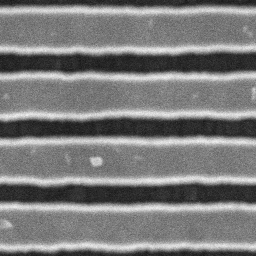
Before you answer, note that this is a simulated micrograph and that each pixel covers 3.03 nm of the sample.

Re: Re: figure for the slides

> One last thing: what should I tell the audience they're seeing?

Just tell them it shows lines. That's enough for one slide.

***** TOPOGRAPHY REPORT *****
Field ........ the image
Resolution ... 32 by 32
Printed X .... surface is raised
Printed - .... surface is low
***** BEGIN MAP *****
--------------------------------
XXXXXXXXXXXXXXXXXXXXXXXXXXXXXXXX
XXXXXXXXXXXXXXXXXXXXXXXXXXXXXXXX
XXXXXXXXXXXXXXXXXXXXXXXXXXXXXXXX
XXXXXXXXXXXXXXXXXXXXXXXXXXXXXXXX
XXXXXXXXXXXXXXXXXXXXXXXXXXXXXXXX
XXXXXXXXXXXXXXXXXXXXXXXXXX------
--------------------------------
--------------------------------
XXXXXXXXXXXXXXXXXXXXXXXXXXXXXXXX
XXXXXXXXXXXXXXXXXXXXXXXXXXXXXXXX
XXXXXXXXXXXXXXXXXXXXXXXXXXXXXXXX
XXXXXXXXXXXXXXXXXXXXXXXXXXXXXXXX
XXXXXXXXXXXXXXXXXXXXXXXXXXXXXXXX
XXXXXXXXXXXXXXXXXXXXXXXXXXXXXXXX
--------------------------------
--------------------------------
XXXXXXXXXXXXXXXXXXXXXXXXXXXXXXXX
XXXXXXXXXXXXXXXXXXXXXXXXXXXXXXXX
XXXXXXXXXXXXXXXXXXXXXXXXXXXXXXXX
XXXXXXXXXXXXXXXXXXXXXXXXXXXXXXXX
XXXXXXXXXXXXXXXXXXXXXXXXXXXXXXXX
XXXXXXXXXXXXXXXXXXXXXXXXXXXXXXXX
--------------------------------
--------------------------------
XXX------------------------XXXX-
XXXXXXXXXXXXXXXXXXXXXXXXXXXXXXXX
XXXXXXXXXXXXXXXXXXXXXXXXXXXXXXXX
XXXXXXXXXXXXXXXXXXXXXXXXXXXXXXXX
XXXXXXXXXXXXXXXXXXXXXXXXXXXXXXXX
XXXXXXXXXXXXXXXXXXXXXXXXXXXXXXXX
--------------------------------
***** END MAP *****